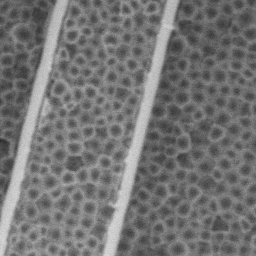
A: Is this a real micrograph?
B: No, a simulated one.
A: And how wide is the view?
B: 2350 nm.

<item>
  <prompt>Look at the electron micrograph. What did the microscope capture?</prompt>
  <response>one or a few lines or trenches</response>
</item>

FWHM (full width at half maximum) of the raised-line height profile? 1020 nanometres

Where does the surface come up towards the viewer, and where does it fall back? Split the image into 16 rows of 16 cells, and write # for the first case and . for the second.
....#######.....
...########.....
...#######......
...#######......
...#######......
..########......
..#######.......
..#######.......
..#######.......
.########.......
.#######........
.#######........
.#######........
########........
#######.........
#######.........